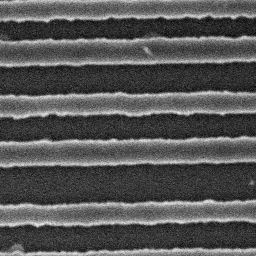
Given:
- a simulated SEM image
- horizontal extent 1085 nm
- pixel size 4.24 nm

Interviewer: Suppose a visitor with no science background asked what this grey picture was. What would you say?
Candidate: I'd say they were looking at lines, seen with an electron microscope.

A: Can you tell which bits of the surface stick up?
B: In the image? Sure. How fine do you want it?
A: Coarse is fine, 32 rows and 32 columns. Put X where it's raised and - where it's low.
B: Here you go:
XXXXXXXXXXXXXXXXXXXXXXXXXXXXXXXX
XXXXXXXXXXXXXXXXXXXXXXXXXXXXXXXX
X-X--X--------------------------
--------------------------------
--------------------------------
XXXXXXXXXXXXXXXXXXXXXXXXXXXXXXXX
XXXXXXXXXXXXXXXXXXXXXXXXXXXXXXXX
XXXXXXXXXXXXXXXXXXXXXXXXXXXXXXXX
--------------------------------
--------------------------------
--------------------------------
--------------------------------
XXXXXXXXXXXXXXXXXXXXXXXXXXXXXXXX
XXXXXXXXXXXXXXXXXXXXXXXXXXXXXXXX
XXXX----------------------------
--------------------------------
--------------------------------
----------------XXXXXX-XXXXXXXXX
XXXXXXXXXXXXXXXXXXXXXXXXXXXXXXXX
XXXXXXXXXXXXXXXXXXXXXXXXXXXXXXXX
XXXXXXXXXXXXXXXXX---------------
--------------------------------
--------------------------------
--------------------------------
--------------------------------
----------XXXXXXXXXXXXXXXXXXXXXX
XXXXXXXXXXXXXXXXXXXXXXXXXXXXXXXX
XXXXXXXXXXXXXXXXXXXXXXXXXXXXXXXX
--------------------------------
--------------------------------
--------------------------------
-----------XXXXXXXXXXXXXXXXXXXXX